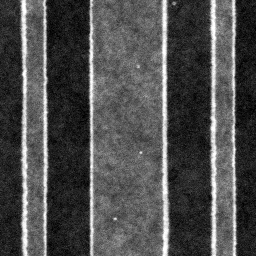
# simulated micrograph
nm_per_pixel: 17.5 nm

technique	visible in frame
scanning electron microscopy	lines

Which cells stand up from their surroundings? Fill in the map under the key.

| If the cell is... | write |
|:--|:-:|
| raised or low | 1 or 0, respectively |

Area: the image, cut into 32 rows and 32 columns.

00011100000111111111000000011000
00011100000111111111000000011000
00011100000111111111000000011000
00011100000111111111000000011000
00011100000111111111000000011000
00011100000111111111000000011000
00011100000111111111000000011000
00011100000111111111000000011000
00011100000111111111000000011000
00011100000111111111000000011000
00011100000111111111000000011000
00011100000111111111000000011000
00011100000111111111000000011000
00011100000111111111000000011000
00011100000111111111000000011000
00011100000111111111000000011000
00011100000111111111000000011000
00011100000111111111000000011000
00011100000111111111000000011000
00011100000111111111000000011000
00011100000111111111000000011000
00011100000111111111000000011000
00011100000111111111000000011000
00011100000111111111000000011000
00011100000111111111000000011000
00011100000111111111000000011000
00011100000011111111000000011000
00011100000011111111000000011000
00011100000011111111100000011000
00011100000011111111000000011000
00011100000011111111000000011000
00011100000111111111000000011000